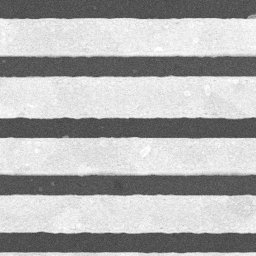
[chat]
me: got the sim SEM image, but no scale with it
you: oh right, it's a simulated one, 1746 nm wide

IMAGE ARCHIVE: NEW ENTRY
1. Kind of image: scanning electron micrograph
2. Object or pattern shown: lines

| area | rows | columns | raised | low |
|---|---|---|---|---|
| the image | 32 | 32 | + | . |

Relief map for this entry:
................................
................................
++++++++++++++++++++++++++++++++
++++++++++++++++++++++++++++++++
++++++++++++++++++++++++++++++++
++++++++++++++++++++++++++++++++
++++++++++++++++++++++++++++++++
................................
................................
................................
++++++++++++++++++++++++++++++++
++++++++++++++++++++++++++++++++
++++++++++++++++++++++++++++++++
++++++++++++++++++++++++++++++++
++++++++++++++++++++++++++++++++
................................
................................
++++++++++++++++++++++++++++++++
++++++++++++++++++++++++++++++++
++++++++++++++++++++++++++++++++
++++++++++++++++++++++++++++++++
++++++++++++++++++++++++++++++++
................................
................................
+++++++++++++++.++++++++++++++++
++++++++++++++++++++++++++++++++
++++++++++++++++++++++++++++++++
++++++++++++++++++++++++++++++++
++++++++++++++++++++++++++++++++
................................
................................
................................